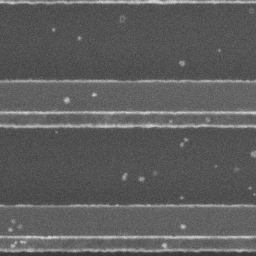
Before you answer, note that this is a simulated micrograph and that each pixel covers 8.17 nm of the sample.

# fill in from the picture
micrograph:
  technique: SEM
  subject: lines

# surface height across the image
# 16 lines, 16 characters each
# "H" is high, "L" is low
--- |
LLLLLLLLLLLLLLLL
LLLLLLLLLLLLLLLL
LLLLLLLLLLLLLLLL
LLLLLLLLLLLLLLLL
LLLLLLLLLLLLLLLL
HHHHHHHHHHHHHHHH
HHHHHHHHHHHHHHHH
HHHHHHHHHHHHHHHH
LLLLLLLLLLLLLLLL
LLLLLLLLLLLLLLLL
LLLLLLLLLLLLLLLL
LLLLLLLLLLLLLLLL
LLLLLLLLLLLLLLLL
HHHHHHHHHHHHHHHH
HHHHHHHHHHHHHHHH
HHHHHHHHHHHHHHHH